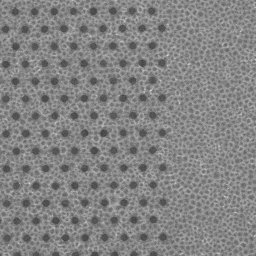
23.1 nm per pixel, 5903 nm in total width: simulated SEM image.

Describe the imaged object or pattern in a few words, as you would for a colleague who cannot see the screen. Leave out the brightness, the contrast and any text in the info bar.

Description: a regular array of raised bodies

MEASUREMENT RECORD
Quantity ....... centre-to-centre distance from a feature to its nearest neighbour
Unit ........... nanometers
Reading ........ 216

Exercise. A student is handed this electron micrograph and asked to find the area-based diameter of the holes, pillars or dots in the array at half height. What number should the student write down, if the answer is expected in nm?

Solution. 186